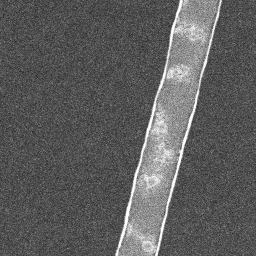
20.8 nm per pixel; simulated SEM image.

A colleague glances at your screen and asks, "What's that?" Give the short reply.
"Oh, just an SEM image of one or a few lines or trenches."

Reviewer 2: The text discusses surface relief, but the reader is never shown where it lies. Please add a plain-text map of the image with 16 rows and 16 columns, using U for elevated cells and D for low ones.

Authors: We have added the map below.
UUUUUUUUUUUDDDUU
UUUUUUUUUUUDDUUU
UUUUUUUUUUUDDUUU
UUUUUUUUUUUDDUUU
UUUUUUUUUUDDDUUU
UUUUUUUUUUDDUUUU
UUUUUUUUUUDDUUUU
UUUUUUUUUDDDUUUU
UUUUUUUUUDDDUUUU
UUUUUUUUUDDUUUUU
UUUUUUUUUDDUUUUU
UUUUUUUUDDDUUUUU
UUUUUUUUDDDUUUUU
UUUUUUUUDDUUUUUU
UUUUUUUUDDUUUUUU
UUUUUUUDDDUUUUUU